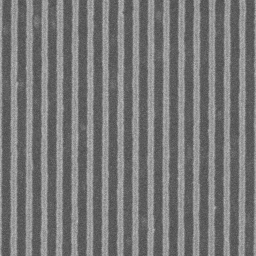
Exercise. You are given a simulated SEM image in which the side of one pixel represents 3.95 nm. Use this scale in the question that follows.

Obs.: parallel lines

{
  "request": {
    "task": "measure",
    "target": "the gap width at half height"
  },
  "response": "40 nanometers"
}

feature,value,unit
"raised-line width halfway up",20.2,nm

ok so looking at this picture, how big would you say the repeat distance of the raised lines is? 60 nm